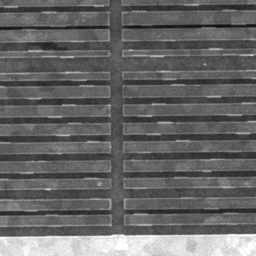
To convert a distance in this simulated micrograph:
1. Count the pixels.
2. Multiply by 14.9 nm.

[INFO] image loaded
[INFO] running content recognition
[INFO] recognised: groups of lines, slits or small figures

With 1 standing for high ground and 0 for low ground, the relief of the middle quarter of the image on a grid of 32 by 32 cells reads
00000000000000000000000000000000
00000000000000000000000000000000
11111111111000011111111111111111
11111111111000011111111111111111
00000000000000000000000000000000
00000000000000000000011111111111
11111111111000011111111111111111
11111111111000011111111111111111
11000000000000000000000000000000
00000000000000000000000000000000
11111111111000011111111111111111
11111111111000011111111111111111
11111111111000011111111111111111
00000000000000000000000000000000
00000000000000000000000000000000
11111111111000011111111111111111
11111111111000011111111111111111
11111100000000000000000000000000
00000000000000000000000000000000
00000000000000000000011111111111
11111111111000011111111111111111
11111111111000011111111111111111
00000000000000000000000000000000
00000000000000000000000000000000
11111111111000011111111111111111
11111111111000011111111111111111
11111111111000011111111111111111
00000000000000000000000000000000
00000000000000000000000000000000
11111111111000011111111111111111
11111111111000011111111111111111
00000000000000000000000000000000